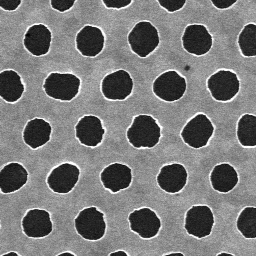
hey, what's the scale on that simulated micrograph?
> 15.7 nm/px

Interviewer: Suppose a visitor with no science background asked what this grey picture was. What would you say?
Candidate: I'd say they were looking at a regular array of holes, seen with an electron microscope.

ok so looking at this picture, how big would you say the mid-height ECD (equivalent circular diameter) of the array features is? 479 nanometres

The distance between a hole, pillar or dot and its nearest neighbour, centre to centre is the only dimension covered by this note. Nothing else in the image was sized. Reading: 824 nm